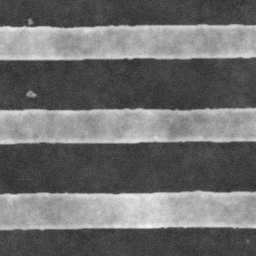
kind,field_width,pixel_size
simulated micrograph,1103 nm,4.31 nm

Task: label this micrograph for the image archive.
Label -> lines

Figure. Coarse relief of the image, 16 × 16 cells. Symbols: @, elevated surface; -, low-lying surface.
----------------
----------------
@@@@@@@@@@@@@@@@
@@@@@@@@@@@@@@@@
----------------
----------------
----------------
@@@@@@@@@@@@@@@@
@@@@@@@@@@@@@@@@
----------------
----------------
----------------
@@@@@@@@@@@@@@@@
@@@@@@@@@@@@@@@@
----------------
----------------